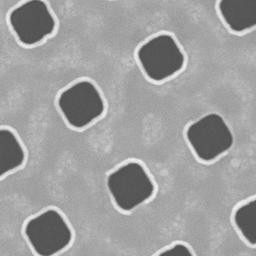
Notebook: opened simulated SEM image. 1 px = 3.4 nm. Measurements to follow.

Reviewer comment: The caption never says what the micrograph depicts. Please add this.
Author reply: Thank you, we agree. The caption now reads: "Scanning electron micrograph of holes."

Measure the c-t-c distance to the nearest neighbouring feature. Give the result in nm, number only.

316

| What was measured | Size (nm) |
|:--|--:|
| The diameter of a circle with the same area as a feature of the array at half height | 144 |